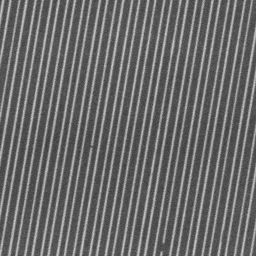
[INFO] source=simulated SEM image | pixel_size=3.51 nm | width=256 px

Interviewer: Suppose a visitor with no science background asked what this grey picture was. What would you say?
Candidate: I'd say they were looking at parallel lines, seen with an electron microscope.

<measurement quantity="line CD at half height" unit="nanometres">6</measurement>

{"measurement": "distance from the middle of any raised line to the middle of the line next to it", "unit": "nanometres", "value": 27.9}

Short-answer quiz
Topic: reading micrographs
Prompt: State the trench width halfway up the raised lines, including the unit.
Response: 21.2 nm